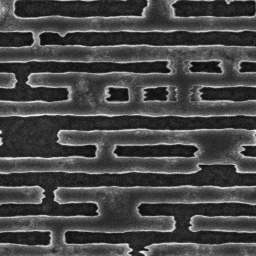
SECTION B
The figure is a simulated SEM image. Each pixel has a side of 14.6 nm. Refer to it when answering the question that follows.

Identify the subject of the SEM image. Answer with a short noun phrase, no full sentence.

parallel lines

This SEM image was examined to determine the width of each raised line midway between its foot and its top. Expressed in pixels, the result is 15.1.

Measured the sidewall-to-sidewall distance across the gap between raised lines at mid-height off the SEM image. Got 198 nm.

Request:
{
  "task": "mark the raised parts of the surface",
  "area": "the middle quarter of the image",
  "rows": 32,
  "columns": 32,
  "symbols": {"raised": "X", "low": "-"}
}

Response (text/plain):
--------------------------XXXXXX
---------------------------XXXX-
XXXXXXXX---XXXXXXX----XXX-XXXXXX
XXXXXXXXXXXXXXXXXXXXXXXXXXXXXXXX
XXXXXXXXXXXXXXXXXXXXXXXXXXXXXXXX
XXXXXXXXXXXXXXXXXXXXXXXX-XXXXXXX
-XXXXXXXXXX-----XXXX------XXXXXX
-XXXXXXXXXX-----XXXX------XXXXXX
-XXXXXXXXXX-----XXXX------XXXXXX
XXXXXXXXXXXXX--XXXXXXXXXXXXXXXXX
XXXXXXXXXXXXXXXXXXXXXXXXXXXXXXXX
XXXXXXXXXXXXXXXXXXXXXXXXXXXXXXXX
XXXXXXXXXXXXXXXXXXXXXXXXXXXXXXXX
--------------------------------
--------------------------------
--------------------------------
----------------XXXXX-----------
XXXXXXXXXXXXXXXXXXXXXXXXXXXXXXXX
XXXXXXXXXXXXXXXXXXXXXXXXXXXXXXXX
XXXXXXXXXXXXXXXXXXXXXXXXXXXXXXXX
--------XXXXX-------------------
--------XXXXX-------------------
--------XXXXX-------------------
XXXXXX-XXXXXXXXXXXXX-XXX-X-XXX--
XXXXXXXXXXXXXXXXXXXXXXXXXXXXXXXX
XXXXXXXXXXXXXXXXXXXXXXXXXXXXXXXX
XXXXXXXXXXXXXXXXXXXXXXXXXXXXXXXX
--------------------------------
--------------------------------
--------------------------------
--------------------------------
XXXXXXXXXXXXXXXXXXXXXXXXXXXXXXXX